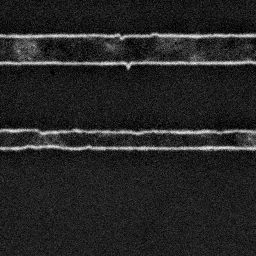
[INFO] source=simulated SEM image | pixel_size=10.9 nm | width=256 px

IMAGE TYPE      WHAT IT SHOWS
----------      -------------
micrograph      one or a few lines or trenches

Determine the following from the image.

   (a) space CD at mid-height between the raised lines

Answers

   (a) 745 nm